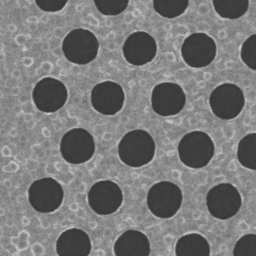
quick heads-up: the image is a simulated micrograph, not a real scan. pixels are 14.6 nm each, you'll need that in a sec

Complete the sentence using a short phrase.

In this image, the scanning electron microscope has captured a regular array of holes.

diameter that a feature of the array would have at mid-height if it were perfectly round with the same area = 35.8 pixels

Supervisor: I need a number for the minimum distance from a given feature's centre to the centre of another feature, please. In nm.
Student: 844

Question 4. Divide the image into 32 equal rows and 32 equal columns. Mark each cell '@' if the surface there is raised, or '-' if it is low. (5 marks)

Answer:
@@@@@---@@@@----@@@-----@@@----@
@@@@@@-@@@@@@--@@@@@---@@@@----@
@@@@@@@@@@@@@@@@@@@@@@@@@@@@@@@@
@@@@@@@@@@@@@@@@@@@@@@@@@@@@@@@@
@@@@@@@@----@@@@---@@@@@--@@@@@-
@@@@@@@@----@@@-----@@@----@@@--
@@@@@@@@----@@@-----@@@----@@@--
@@@@@@@@----@@@@---@@@@----@@@--
@@@@@@@@@@@@@@@@@@@@@@@@-@@@@@@-
@@@@@@@@@@@@@@@@@@@@@@@@@@@@@@@@
@@@@@---@@@@---@@@@@--@@@@@@-@@@
@@@@----@@@----@@@@----@@@----@@
@@@@----@@@-----@@@----@@@-----@
@@@@@---@@@@---@@@@----@@@----@@
@@@@@@@@@@@@@@@@@@@@@@@@@@@---@@
@@@@@@@@@@@@@@@@@@@@@@@@@@@@@@@@
@@@@@@@@---@@@@@--@@@@@@-@@@@@@@
@@@@@@@@----@@@----@@@@---@@@@--
@@@@@@@-----@@@----@@@-----@@@--
@@@@@@@@----@@@----@@@-----@@@--
@@@@@@@@@-@@@@@@--@@@@@---@@@@--
@@@@@@@@@@@@@@@@@@@@@@@@@@@@@@@@
@@@@@--@@@@@@@@@@@@@@@@@@@@@@@@@
@@@@----@@@----@@@@---@@@@@--@@@
@@@-----@@@----@@@-----@@@----@@
@@@@----@@@----@@@-----@@@----@@
@@@@@-@@@@@@--@@@@@---@@@@----@@
@@@@@@@@@@@@@@@@@@@@@@@@@@@@@@@@
@@@@@@@@@@@@@@@@@@@@@@@@@@@@@@@@
@@@@@@@----@@@@---@@@@@--@@@@@--
@@@@@@@----@@@-----@@@----@@@---
@@@@@@@----@@@-----@@@----@@@---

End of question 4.